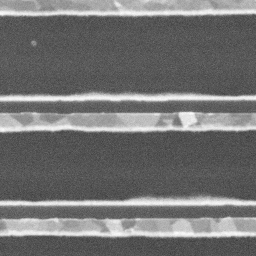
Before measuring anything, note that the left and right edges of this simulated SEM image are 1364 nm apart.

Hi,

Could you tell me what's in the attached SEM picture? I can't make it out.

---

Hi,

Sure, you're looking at lines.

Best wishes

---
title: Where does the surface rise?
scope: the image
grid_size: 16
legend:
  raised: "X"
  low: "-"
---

XXXXXXXXXXXXXXXX
----------------
----------------
----------------
----------------
----------------
XXXXXXXXXXXXXXXX
XXXXXXXXXXXXXXXX
----------------
----------------
----------------
----------------
----------------
XXXXXXXXXXXXXXXX
XXXXXXXXXXXXXXXX
----------------